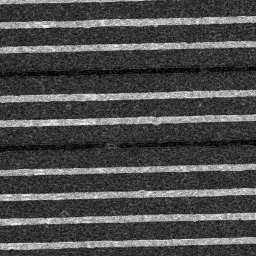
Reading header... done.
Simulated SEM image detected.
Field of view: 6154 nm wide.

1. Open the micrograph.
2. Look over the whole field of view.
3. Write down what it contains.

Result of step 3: parallel lines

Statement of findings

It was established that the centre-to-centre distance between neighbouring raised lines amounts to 590 nm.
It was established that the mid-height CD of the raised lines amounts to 0.144 microns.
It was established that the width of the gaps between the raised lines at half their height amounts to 451 nm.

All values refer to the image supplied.